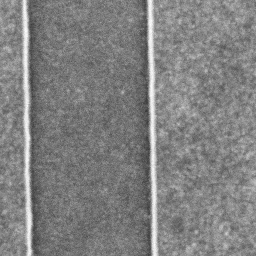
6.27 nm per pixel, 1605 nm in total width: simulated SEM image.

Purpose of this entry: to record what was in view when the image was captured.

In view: one or a few lines or trenches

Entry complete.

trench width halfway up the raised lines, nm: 785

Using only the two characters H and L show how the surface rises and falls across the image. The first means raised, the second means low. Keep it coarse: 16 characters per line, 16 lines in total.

HHLLLLLLLHHHHHHH
HHLLLLLLLHHHHHHH
HHLLLLLLLHHHHHHH
HHLLLLLLLHHHHHHH
HHLLLLLLLLHHHHHH
HHLLLLLLLHHHHHHH
HHLLLLLLLLHHHHHH
HHLLLLLLLLHHHHHH
HHLLLLLLLLHHHHHH
HHLLLLLLLLHHHHHH
HHLLLLLLLLHHHHHH
HHLLLLLLLLHHHHHH
HHLLLLLLLLHHHHHH
HHLLLLLLLLHHHHHH
HHLLLLLLLLHHHHHH
HHLLLLLLLLHHHHHH